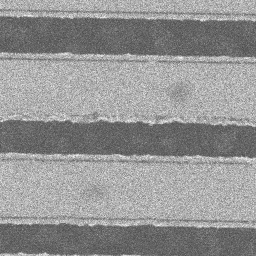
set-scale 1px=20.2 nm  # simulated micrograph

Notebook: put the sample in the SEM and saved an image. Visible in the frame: one or a few lines or trenches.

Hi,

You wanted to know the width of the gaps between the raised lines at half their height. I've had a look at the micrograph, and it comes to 1270 nanometres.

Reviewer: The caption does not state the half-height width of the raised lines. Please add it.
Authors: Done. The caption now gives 826 nm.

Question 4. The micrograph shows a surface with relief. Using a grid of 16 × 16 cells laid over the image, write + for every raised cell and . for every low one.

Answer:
................
++++++++++++++++
++++++++++++++++
..++++++++++++++
................
................
................
++++++++++++....
++++++++++++++++
++++++++++++++++
................
................
................
................
++++++++++++++++
++++++++++++++++